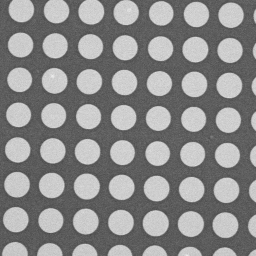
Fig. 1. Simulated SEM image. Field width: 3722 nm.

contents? an array of small figures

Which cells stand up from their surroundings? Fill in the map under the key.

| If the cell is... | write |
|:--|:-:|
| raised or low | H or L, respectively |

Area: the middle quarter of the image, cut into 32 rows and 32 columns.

LLLLLLLLLLLLLLLLLLLLLLLLLLLLLLLL
LLLLLLHLLLLLLLLLLLLLLLLLLLLLLLLL
LLLLHHHHHLLLLHHHHLLLLLHHHHLLLLLH
HLLHHHHHHLLLHHHHHHLLLHHHHHHLLLHH
HLLHHHHHHLLLHHHHHHLLLHHHHHHLLLHH
HLLHHHHHHLLLHHHHHHLLLHHHHHHLLHHH
LLLLHHHHHLLLLHHHHHLLLHHHHHHLLLHH
LLLLLLLLLLLLLLHHLLLLLLHHHLLLLLLH
LLLLLLLLLLLLLLLLLLLLLLLLLLLLLLLL
LLLLLLLLLLLLLLLLLLLLLLLLLLLLLLLL
LLLLLHHHLLLLLLHHLLLLLLLLLLLLLLLL
LLLLHHHHHLLLHHHHHLLLLHHHHHLLLLHH
LLLHHHHHHLLLHHHHHHLLLHHHHHLLLLHH
LLLHHHHHHLLLHHHHHHLLLHHHHHHLLHHH
LLLHHHHHHLLLHHHHHHLLLHHHHHHLLHHH
LLLLHHHHLLLLLHHHHLLLLHHHHHLLLLHH
LLLLLLLLLLLLLLLLLLLLLLLLLLLLLLLH
LLLLLLLLLLLLLLLLLLLLLLLLLLLLLLLL
LLLLLLLLLLLLLLLLLLLLLLLLLLLLLLLL
LLLLHHHHLLLLLHHHLLLLLLLHHLLLLLLL
LLLHHHHHHLLLHHHHHLLLLHHHHHLLLLHH
LLLHHHHHHLLLHHHHHHLLHHHHHHLLLHHH
LLLHHHHHHLLLHHHHHLLLHHHHHHLLLHHH
LLLHHHHHHLLLHHHHHLLLLHHHHHLLLHHH
LLLLHHHHLLLLLHHHHLLLLHHHHHLLLLHH
LLLLLLLLLLLLLLLLLLLLLLLLLLLLLLLH
LLLLLLLLLLLLLLLLLLLLLLLLLLLLLLLL
LLLLLLLLLLLLLLLLLLLLLLLLLLLLLLLL
LLLHHHHHLLLLHHHHLLLLLHHHHLLLLLLH
LLLHHHHHHLLHHHHHHLLLHHHHHHLLLLHH
LLLHHHHHHLLHHHHHHHLLHHHHHHLLLHHH
LLLHHHHHHLLHHHHHHLLLHHHHHHLLLHHH